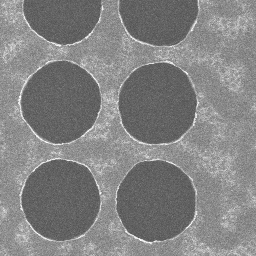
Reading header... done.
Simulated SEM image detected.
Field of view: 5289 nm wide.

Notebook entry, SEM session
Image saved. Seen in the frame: holes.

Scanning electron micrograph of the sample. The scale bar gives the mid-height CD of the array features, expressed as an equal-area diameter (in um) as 1.67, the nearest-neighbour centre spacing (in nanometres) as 1980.